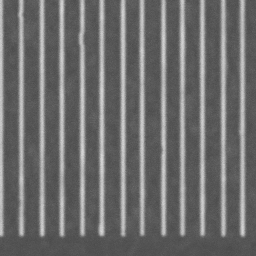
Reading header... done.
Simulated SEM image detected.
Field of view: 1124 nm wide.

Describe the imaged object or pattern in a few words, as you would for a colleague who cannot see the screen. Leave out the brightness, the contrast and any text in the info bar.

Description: parallel lines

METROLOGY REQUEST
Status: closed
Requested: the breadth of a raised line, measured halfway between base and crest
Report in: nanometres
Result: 13.2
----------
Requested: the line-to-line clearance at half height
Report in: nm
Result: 72.5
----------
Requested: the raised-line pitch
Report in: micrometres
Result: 0.0883